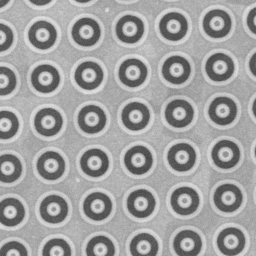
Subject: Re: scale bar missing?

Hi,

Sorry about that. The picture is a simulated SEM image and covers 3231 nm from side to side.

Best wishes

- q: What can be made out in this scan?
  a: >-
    an array of small figures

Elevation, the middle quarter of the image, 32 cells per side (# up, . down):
###.......###........###....#...
##........###...##...###...##...
##...##...###...##...###........
##...##...###........###........
##........####.......####......#
###......######.....#######..###
####....########################
################################
###########################...##
################....######......
#####....######......####.......
###.......####........###...#...
###........###...##...###...##..
###...##...###...##...###.......
###...##...###........###.......
###........###.......#####......
####......#####.....############
#####....#######################
################################
############################...#
################.....#####......
#####.....#####.......####......
####.......####.......###....#..
####........###...##...##...###.
.##....##...###...##...###......
.###...##...###.......####......
.###.......####.......#####.....
#####......#####.....########.##
######...#######################
################################
############################....
########.########.....#####.....